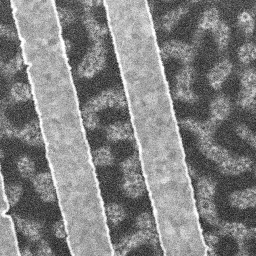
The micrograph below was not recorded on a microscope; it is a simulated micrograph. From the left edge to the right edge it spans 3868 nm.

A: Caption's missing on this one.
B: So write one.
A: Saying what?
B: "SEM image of one or a few lines or trenches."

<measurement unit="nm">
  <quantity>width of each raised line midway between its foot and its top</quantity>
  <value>614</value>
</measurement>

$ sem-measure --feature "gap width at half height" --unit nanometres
753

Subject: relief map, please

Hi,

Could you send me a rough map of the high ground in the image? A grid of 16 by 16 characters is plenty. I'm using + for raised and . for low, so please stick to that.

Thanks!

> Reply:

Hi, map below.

.++....++.......
.+++...+++......
.+++...+++......
.+++...+++......
..++....++......
..+++...++......
..+++...+++.....
..+++...+++.....
...++...+++.....
...+++...++.....
...+++...+++....
...+++...+++....
....++...+++....
+...+++...++....
+...+++...+++...
+...+++...+++...